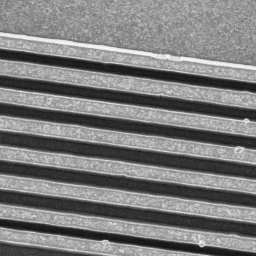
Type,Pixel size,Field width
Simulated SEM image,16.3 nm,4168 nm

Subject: parallel lines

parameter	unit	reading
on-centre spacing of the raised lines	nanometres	451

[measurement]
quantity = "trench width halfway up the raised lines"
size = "182 nm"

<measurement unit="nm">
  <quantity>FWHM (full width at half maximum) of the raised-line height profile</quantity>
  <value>256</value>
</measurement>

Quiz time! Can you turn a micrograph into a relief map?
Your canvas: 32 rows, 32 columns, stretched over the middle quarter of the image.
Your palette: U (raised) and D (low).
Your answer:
DDDDDDDDDDDDDDDUUUUUUUUUUUUUUUUU
UUUUUDDDDDDDDDDDDDDDDDUUUUUUUUUU
UUUUUUUUUUUUUDDDDDDDDDDDDDDDDDUU
UUUUUUUUUUUUUUUUUUUUUDDDDDDDDDDD
UUUUUUUUUUUUUUUUUUUUUUUUUUUUDDDD
DDDUUUUUUUUUUUUUUUUUUUUUUUUUUUUU
DDDDDDDDDDDDUUUUUUUUUUUUUUUUUUUU
DDDDDDDDDDDDDDDDDDDDUUUUUUUUUUUU
UUUUUDDDDDDDDDDDDDDDDDDDDDDUUUUU
UUUUUUUUUUUUUDDDDDDDDDDDDDDDDDDD
UUUUUUUUUUUUUUUUUUUUDDDDDDDDDDDD
UUUUUUUUUUUUUUUUUUUUUUUUUUDDDDDD
DDDDDUUUUUUUUUUUUUUUUUUUUUUUUUUU
DDDDDDDDDDDDUUUUUUUUUUUUUUUUUUUU
DDDDDDDDDDDDDDDDDDDDUUUUUUUUUUUU
UUUUUDDDDDDDDDDDDDDDDDDDDDDUUUUU
UUUUUUUUUUUUDDDDDDDDDDDDDDDDDDDD
UUUUUUUUUUUUUUUUUUUUDDDDDDDDDDDD
UUUUUUUUUUUUUUUUUUUUUUUUUUUDDDDD
DDDDDUUUUUUUUUUUUUUUUUUUUUUUUUUU
DDDDDDDDDDDDUUUUUUUUUUUUUUUUUUUU
DDDDDDDDDDDDDDDDDDDUUUUUUUUUUUUU
UDDDDDDDDDDDDDDDDDDDDDDDDDDUUUUU
UUUUUUUUUDDDDDDDDDDDDDDDDDDDDDDD
UUUUUUUUUUUUUUUUDDDDDDDDDDDDDDDD
UUUUUUUUUUUUUUUUUUUUUUUDDDDDDDDD
DDDUUUUUUUUUUUUUUUUUUUUUUUUUUDDD
DDDDDDDDDDUUUUUUUUUUUUUUUUUUUUUU
DDDDDDDDDDDDDDDDDDUUUUUUUUUUUUUU
DDDDDDDDDDDDDDDDDDDDDDDDDUUUUUUU
UUUUUUUDDDDDDDDDDDDDDDDDDDDDDDDU
UUUUUUUUUUUUUUDDDDDDDDDDDDDDDDDD